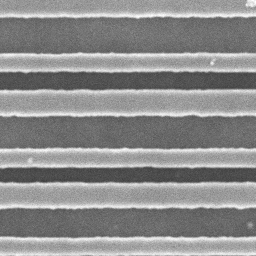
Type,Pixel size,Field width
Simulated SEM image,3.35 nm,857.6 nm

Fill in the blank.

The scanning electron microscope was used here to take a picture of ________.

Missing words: lines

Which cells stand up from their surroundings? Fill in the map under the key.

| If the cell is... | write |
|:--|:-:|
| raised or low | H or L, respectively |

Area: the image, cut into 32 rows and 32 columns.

HHHHHHHHHHHHHHHHHHHHHHHHHHHHHHHH
HHHHHHHHHHHHHHHHHHHHHHHHHHHHHHHH
LLLLLLLLLLLLLLLLLLLLLLLLLLLLLLLL
LLLLLLLLLLLLLLLLLLLLLLLLLLLLLLLL
LLLLLLLLLLLLLLLLLLLLLLLLLLLLLLLL
LLLLLLLLLLLLLLLLLLLLLLLLLLLLLLLL
LLLLLLLLLLLLLLLLLLLLLLLLLLLLLLLL
HHHHHHHHHHHHHHHHHHHHHHHHHHHHHHHH
HHHHHHHHHHHHHHHHHHHHHHHHHHHHHHHH
LLLLLLLLLLLLLLLLLLLLLLLLLLLLLLLL
LLLLLLLLLLLLLLLLLLLLLLLLLLLLLLLL
HHHHHHHHHHHHHHHHHHHHHHHHHHHHHHHH
HHHHHHHHHHHHHHHHHHHHHHHHHHHHHHHH
HHHHHHHHHHHHHHHHHHHHHHHHHHHHHHHH
HHHHHHLLLHHHLLHHHLLLHHHLLHHLHHLL
LLLLLLLLLLLLLLLLLLLLLLLLLLLLLLLL
LLLLLLLLLLLLLLLLLLLLLLLLLLLLLLLL
LLLLLLLLLLLLLLLLLLLLLLLLLLLLLLLL
LLLLLLLLLLLLLLLLLLLLLLLLLLLLLLLL
HHHHHHHHHHHHHHHHHHHHHHHHHHHHHHHH
HHHHHHHHHHHHHHHHHHHHHHHHHHHHHHHH
LLLLLLLLLLLLLLLLLLLLLLLLLLLLLLLL
LLLLLLLLLLLLLLLLLLLLLLLLLLLLLLLL
HHHHHHHHHHHHHHHHHHHHHHHHHHHHHHHH
HHHHHHHHHHHHHHHHHHHHHHHHHHHHHHHH
HHHHHHHHHHHHHHHHHHHHHHHHHHHHHHHH
LLLLLLLLLLLLLLLLLLLLLLLLLLLLLLLL
LLLLLLLLLLLLLLLLLLLLLLLLLLLLLLLL
LLLLLLLLLLLLLLLLLLLLLLLLLLLLLLLL
LLLLLLLLLLLLLLLLLLLLLLLLLLLLLLLL
HHHHHHHHHHHHHHHHHHHHHHHHHHHHHHHH
HHHHHHHHHHHHHHHHHHHHHHHHHHHHHHHH